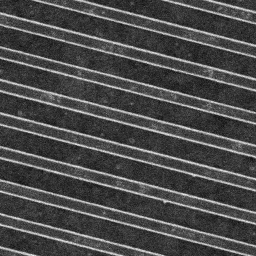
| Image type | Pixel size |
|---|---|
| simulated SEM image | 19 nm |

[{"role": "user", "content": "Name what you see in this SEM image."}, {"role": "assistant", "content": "parallel lines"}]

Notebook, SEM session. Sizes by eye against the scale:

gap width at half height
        398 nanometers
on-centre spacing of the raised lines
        616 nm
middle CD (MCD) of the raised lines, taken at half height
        216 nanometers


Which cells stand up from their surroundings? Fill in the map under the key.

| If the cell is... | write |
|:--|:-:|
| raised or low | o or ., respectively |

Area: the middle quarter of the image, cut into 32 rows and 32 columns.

oo......................oooooooo
oooooo......................oooo
oooooooooo......................
....oooooooooo..................
.......ooooooooooo..............
...........ooooooooooo..........
...............oooooooooo.......
...................oooooooooo...
oo.....................ooooooooo
oooooo.....................ooooo
ooooooooo......................o
..ooooooooooo...................
......ooooooooooo...............
..........ooooooooooo...........
..............ooooooooooo.......
..................ooooooooooo...
......................oooooooooo
oooo.....................ooooooo
oooooooo.....................ooo
.ooooooooooo....................
.....ooooooooooo................
.........ooooooooooo............
............oooooooooooo........
................ooooooooooo.....
....................ooooooooooo.
ooo.....................oooooooo
ooooooo.....................oooo
ooooooooooo.....................
...ooooooooooo..................
.......ooooooooooo..............
...........ooooooooooo..........
...............ooooooooooo......